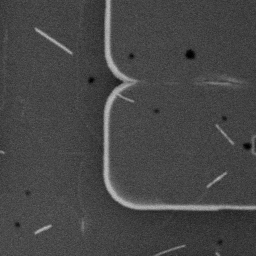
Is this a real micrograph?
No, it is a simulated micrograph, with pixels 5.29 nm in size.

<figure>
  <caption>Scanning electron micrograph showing wiring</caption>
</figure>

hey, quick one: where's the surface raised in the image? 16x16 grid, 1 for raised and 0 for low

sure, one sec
0000000111111111
0000000111111111
0000000111111111
0000000111111111
0000000111111111
0000000111111111
0000000111111111
0000000111111111
0000000111111111
0000000111111111
0000000111111111
0000000111111111
0000000111111111
0000000000000000
0000000000000000
0000000000000000